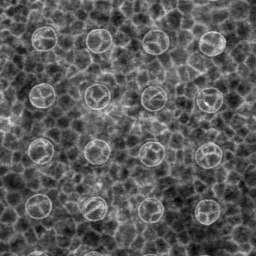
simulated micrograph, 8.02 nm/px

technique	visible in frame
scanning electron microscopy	a regular array of raised bodies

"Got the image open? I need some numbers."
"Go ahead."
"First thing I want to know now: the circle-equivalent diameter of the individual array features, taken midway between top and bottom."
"202 nanometers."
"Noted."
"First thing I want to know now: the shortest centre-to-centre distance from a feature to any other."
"55.3 px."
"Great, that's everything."